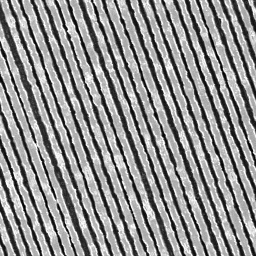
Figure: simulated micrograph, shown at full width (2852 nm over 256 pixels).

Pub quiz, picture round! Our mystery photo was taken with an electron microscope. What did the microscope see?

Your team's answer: parallel lines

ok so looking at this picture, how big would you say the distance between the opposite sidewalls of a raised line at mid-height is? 73.3 nanometres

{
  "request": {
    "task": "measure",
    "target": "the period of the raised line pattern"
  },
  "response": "0.124 um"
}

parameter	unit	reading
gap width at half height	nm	52.4